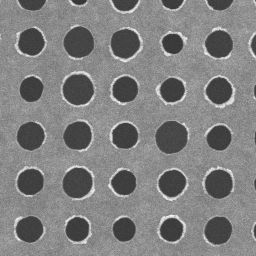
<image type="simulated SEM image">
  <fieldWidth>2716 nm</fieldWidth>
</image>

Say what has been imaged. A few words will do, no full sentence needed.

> a regular array of holes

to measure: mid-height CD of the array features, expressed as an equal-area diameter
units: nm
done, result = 282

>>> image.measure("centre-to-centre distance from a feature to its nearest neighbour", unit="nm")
491